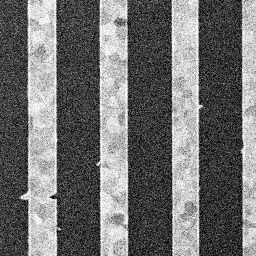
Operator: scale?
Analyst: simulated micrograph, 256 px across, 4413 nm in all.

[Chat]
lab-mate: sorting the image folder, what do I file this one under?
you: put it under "one or a few lines or trenches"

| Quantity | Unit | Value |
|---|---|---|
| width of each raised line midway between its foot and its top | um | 0.442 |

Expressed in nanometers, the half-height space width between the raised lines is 784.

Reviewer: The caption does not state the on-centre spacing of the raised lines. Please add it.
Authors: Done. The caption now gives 1.23 microns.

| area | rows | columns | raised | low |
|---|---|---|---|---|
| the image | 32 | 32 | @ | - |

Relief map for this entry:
----@@@------@@@------@@@-----@@
----@@@------@@@------@@@-----@@
----@@@------@@@------@@@-----@@
----@@@------@@@------@@@-----@@
----@@@------@@@------@@@-----@@
----@@@------@@@------@@@-----@@
----@@@------@@@------@@@-----@@
----@@@------@@@------@@@-----@@
----@@@------@@@------@@@-----@@
----@@@------@@@------@@@-----@@
----@@@------@@@------@@@-----@@
----@@@------@@@------@@@-----@@
----@@@------@@@------@@@-----@@
----@@@------@@@------@@@-----@@
----@@@------@@@------@@@-----@@
----@@@------@@@------@@@-----@@
----@@@------@@@------@@@-----@@
----@@@------@@@------@@@-----@@
----@@@------@@@------@@@-----@@
----@@@------@@@------@@@-----@@
----@@@------@@@------@@@-----@@
----@@@------@@@------@@@-----@@
----@@@------@@@------@@@-----@@
----@@@------@@@------@@@------@
---@@@@------@@@------@@@------@
----@@@------@@@------@@@------@
----@@@------@@@------@@@------@
----@@@------@@@------@@@------@
----@@@------@@@------@@@------@
----@@@------@@@------@@@------@
----@@@------@@@------@@@------@
----@@@------@@@------@@@------@